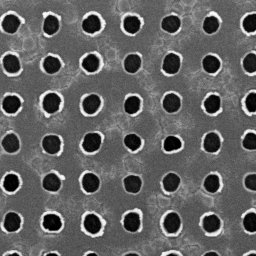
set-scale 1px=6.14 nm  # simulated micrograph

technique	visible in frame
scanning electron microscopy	a regular array of holes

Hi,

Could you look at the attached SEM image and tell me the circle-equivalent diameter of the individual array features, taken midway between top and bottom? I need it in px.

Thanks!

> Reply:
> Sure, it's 18.2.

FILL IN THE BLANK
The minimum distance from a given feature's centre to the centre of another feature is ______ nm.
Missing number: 239